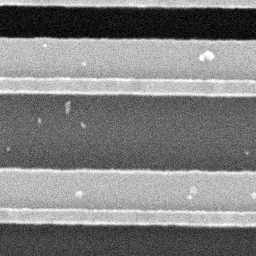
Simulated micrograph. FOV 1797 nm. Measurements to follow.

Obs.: lines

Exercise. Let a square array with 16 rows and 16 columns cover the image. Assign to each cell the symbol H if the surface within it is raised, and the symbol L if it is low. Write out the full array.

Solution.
LLLLLLLLLLLLLLLL
LLLLLLLLLLLLLLLL
HHHHHHHLHHLLLLLL
HHHHHHHHHHHHHHHH
HHHHHHHHHHHHHHHH
HHHHHHHHHHHHHHHH
LLLLLLLLLLLLLLLL
LLLLLLLLLLLLLLLL
LLLLLLLLLLLLLLLL
LLLLLLLLLLLLLLLL
LLLLLLLLLLLLLLLL
HHHHHHHHHHHHHHHH
HHHHHHHHHHHHHHHH
HHHHHHHHHHHHHHHH
LLLLLLLLLLLLLLLL
LLLLLLLLLLLLLLLL